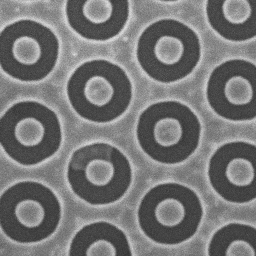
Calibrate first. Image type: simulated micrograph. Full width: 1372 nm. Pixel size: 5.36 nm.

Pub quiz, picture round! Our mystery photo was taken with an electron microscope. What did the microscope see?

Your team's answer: ring-shaped grooves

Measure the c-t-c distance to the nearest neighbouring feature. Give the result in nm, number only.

431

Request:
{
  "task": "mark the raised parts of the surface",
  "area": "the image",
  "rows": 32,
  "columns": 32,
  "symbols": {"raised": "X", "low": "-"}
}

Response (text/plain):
XXXXXXXX---XXX--XXXXXXXXXX--XXX-
XXXXXXXX--XXXX--XXXXXXXXXX--XXX-
XXX-XXXX---XX---XXXX--XXXX---XX-
X-----XXX------XXX------XXX-----
-------XXX-----XXX-------XXX----
--XXX--XXXXXXXXXX---XXX--XXXXXXX
--XXX--XXXXXXXXXX--XXXX--XXXXXXX
--XXX--XXXXX-XXXX---XX---XXXX-XX
-------XXX-----XXX------XXX-----
X-----XXX-------XXX----XXX------
XXXXXXXX---XXX--XXXXXXXXXX--XXX-
XXXXXXXX---XXX--XXXXXXXXXX--XXX-
XXXXXXXXX--XXX--XXXXXXXXXX---XX-
X-----XXX-------XX------XX------
-------XXX-----XX--------XX-----
--XXX---XXXXXXXXX---XX---XXXXXXX
--XXX---XXXXXXXXX--XXXX--XXXXXXX
--XXX---XXXXXXXXX---XX---XXXXXXX
-------XXX-----XXX-------XX-----
X-----XXX-------XXX-----XXX-----
XX---XXXX--XXX--XXXXX-XXXX---XX-
XXXXXXXX---XXX--XXXXXXXXXX--XXXX
XXXXXXXX---XXX--XXXXXXXXXX---XX-
X-----XXX-------XXX-----XXX-----
-------XXX-----XXX-------XXX----
--XXX---XXX--XXXX---XXX--XXXXXXX
--XXX---XXXXXXXXX---XXX--XXXXXXX
--XXX--XXXXXXXXXX---XXX--XXXXXXX
-------XXX-----XXX-------XX-----
X-----XXX-------XX------XXX-----
XXXXXXXXX---XX--XXXX--XXXX---XX-
XXXXXXXXX--XXX--XXXXXXXXXX--XXXX